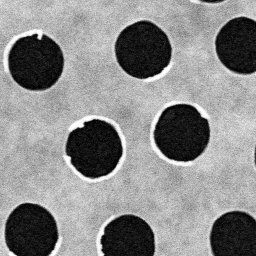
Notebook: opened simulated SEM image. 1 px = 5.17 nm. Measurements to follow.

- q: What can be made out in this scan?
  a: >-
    holes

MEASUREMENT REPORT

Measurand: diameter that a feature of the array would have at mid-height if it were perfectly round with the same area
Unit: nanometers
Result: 293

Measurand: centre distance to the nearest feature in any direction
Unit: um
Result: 0.466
